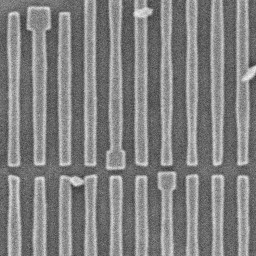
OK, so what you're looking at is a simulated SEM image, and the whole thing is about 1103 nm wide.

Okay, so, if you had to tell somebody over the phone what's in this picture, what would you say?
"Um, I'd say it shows wiring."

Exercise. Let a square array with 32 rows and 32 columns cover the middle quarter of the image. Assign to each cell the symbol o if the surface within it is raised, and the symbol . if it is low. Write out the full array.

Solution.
oo...ooo....oo....ooo...ooo....o
oo...ooo....oo....ooo...ooo....o
oo...ooo....oo....ooo...ooo....o
oo...ooo....oo....ooo...ooo....o
oo...ooo....oo....ooo...ooo....o
oo...ooo....oo....ooo...ooo....o
o....ooo....oo....ooo...ooo....o
o....ooo...ooo....ooo...ooo....o
oo...ooo...ooo....ooo...ooo....o
oo...ooo...ooo....ooo...ooo....o
oo...ooo...ooo....ooo...ooo....o
oo...ooo...ooo....ooo...ooo....o
oo...ooo...ooo....ooo...ooo....o
oo...ooo...ooo....ooo...ooo....o
oo...ooo...ooo....ooo...ooo....o
oo...ooo....oo....ooo....oo....o
o....ooo....oo....ooo....oo....o
o....ooo....oo....ooo....oo....o
o....ooo....oo....ooo....oo....o
o....ooo....oo....ooo....oo....o
oo...ooo....oo....ooo...ooo....o
oo...ooo...ooo....ooo...ooo....o
oo...ooo...oooo...ooo...ooo....o
oo...ooo...oooo...ooo...ooo....o
oo...ooo...oooo...ooo...ooo....o
...........oooo.................
................................
........................oooo....
oooo.ooo....oo....ooo...oooo...o
oooooooo....oo....ooo...oooo...o
oo...ooo....oo....ooo...oooo...o
oo...ooo....oo....ooo...ooo....o